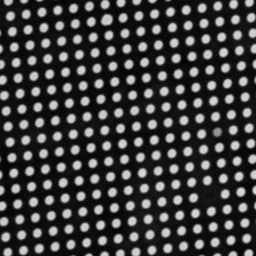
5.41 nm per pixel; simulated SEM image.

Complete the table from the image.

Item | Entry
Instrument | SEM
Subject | a regular array of raised bodies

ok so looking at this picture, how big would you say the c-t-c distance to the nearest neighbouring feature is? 0.0838 um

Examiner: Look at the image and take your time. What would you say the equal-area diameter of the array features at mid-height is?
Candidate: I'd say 47.6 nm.